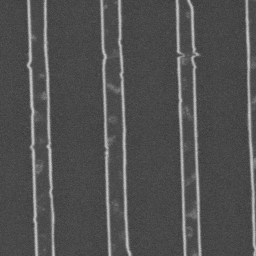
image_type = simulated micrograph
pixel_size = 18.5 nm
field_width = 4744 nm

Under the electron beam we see one or a few lines or trenches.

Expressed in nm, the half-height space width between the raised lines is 1040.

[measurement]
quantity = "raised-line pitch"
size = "1.37 micrometres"